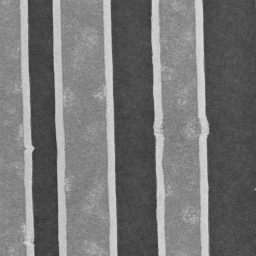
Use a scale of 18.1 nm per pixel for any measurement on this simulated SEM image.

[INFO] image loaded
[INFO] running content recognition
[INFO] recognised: one or a few lines or trenches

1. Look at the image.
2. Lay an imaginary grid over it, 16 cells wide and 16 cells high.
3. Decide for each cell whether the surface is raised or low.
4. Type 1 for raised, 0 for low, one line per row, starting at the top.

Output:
1101111000110000
1100111000110000
1100111000111000
1100111000111000
1100111000111000
1100111000111000
1100111000111000
1100111000111000
1100111000111000
1100111000111000
1100111000111000
1100111000111000
1100111000111000
1100111000111000
1100111000111000
1100111000111000